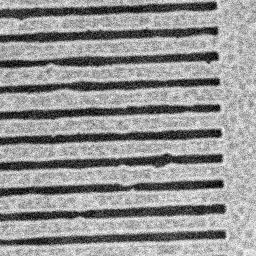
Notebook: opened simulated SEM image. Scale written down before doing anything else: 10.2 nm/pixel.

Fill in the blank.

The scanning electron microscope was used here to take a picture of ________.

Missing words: parallel lines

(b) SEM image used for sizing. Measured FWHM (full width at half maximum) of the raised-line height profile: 13.5 pixels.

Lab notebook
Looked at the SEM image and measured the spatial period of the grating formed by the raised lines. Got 259 nm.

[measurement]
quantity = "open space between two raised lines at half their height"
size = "118 nm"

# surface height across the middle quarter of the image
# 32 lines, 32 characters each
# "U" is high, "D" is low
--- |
DDDDDDDDDDDDDDDDDDDDDUUUUUUUUUUU
UUUUUUUUUUUUUUUUUUUUUUUUUUUUUUUU
UUUUUUUUUUUUUUUUUUUUUUUUUUUUUUUU
UUUUUUUUUUUUUUUUUUUDUUDUUDDUUDDD
DDDDDDDDDDDDDDDDDDDDDDDDDDDDDDDD
DDDDDDDDDDDDDDDDDDDDDDDDDDDDDDDD
DDDDDDDDDDDDDDDDDDDDDDDUUUUUUUUU
UUUUUDDUUUUUUUUUUUUUUUUUUUUUUUUU
UUUUUUUUUUUUUUUUUUUUUUUUUUUUUUUU
UUUUUUUUUUUUUUUUUUUUUUUUUUUUUUUU
UUUUUDDDDDUDDDDDDDDDDDDDDDDDDDDD
DDDDDDDDDDDDDDDDDDDDDDDDDDDDDDDD
DDDDDDDDDDDDDDDDDDDDDDDDDDDDDDDD
DDDDDDDDDUUUUUDUUUUUUUUUUUUUUUUU
UUUUUUUUUUUUUUUUUUUUUUUUUUUUUUUU
UUUUUUUUUUUUUUUUUUUUUUUUUUUUUUUU
UUUUUUUUUUUUUUUUUDDDDUUUUDDDDDDD
DDDDDDDDDDDDDDDDDDDDDDDDDDDDDDDD
DDDDDDDDDDDDDDDDDDDDDDDDDDDDDDDD
DDDDDDDDDDDDDDDDDDDDDDUUDDDDUUUU
UUUUUUUUUUUUUUUUUUUUUUUUUUUUUUUU
UUUUUUUUUUUUUUUUUUUUUUUUUUUUUUUU
UUUUUUUUUUUUUUUUUUUUDDUUDDDDDDDD
DDDDDDDDDDDDDDDDDDDDDDDDDDDDDDDD
DDDDDDDDDDDDDDDDDDDDDDDDDDDDDDDD
DDDDDDDDDDDDDDDDDDDDDDDDDDUUDDUD
DDDDDDUUUUUUUUUUUUUUUUUUUUUUUUUU
UUUUUUUUUUUUUUUUUUUUUUUUUUUUUUUU
UUUUUUUUUUUUUUUUUUUUUUUUUUUUUUUU
UUUUUUDDDDDDDDUUUUDDDDDDDDDDDDDD
DDDDDDDDDDDDDDDDDDDDDDDDDDDDDDDD
DDDDDDDDDDDDDDDDDDDDDDDDDDDDDDDD